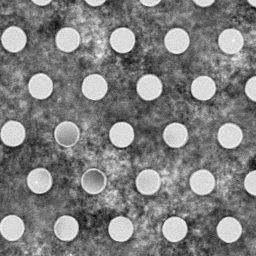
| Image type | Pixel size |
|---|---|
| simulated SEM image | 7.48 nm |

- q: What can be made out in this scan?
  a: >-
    a regular array of raised bodies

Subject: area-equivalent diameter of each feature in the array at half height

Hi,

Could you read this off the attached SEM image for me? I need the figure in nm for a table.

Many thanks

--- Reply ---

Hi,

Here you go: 186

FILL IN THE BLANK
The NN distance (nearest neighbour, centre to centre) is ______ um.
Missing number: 0.404